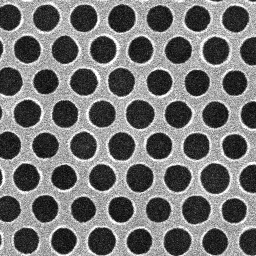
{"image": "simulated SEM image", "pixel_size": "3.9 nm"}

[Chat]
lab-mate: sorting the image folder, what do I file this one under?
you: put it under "a regular array of holes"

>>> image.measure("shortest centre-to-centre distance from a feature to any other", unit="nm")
143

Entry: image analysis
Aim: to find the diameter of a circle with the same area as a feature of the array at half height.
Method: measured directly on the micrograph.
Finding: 106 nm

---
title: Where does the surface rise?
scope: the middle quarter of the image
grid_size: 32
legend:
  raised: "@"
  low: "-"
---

@@@@@@@@@@@@@@@@@@@@@@@@@@@@@@@@
@@@----@@@@@----@@@@@@---@@@@@@@
@@------@@@------@@@@------@@@@-
@@------@@@-------@@@------@@@--
@@------@@@-------@@-------@@@--
@@------@@@-------@@@------@@@--
@@------@@@------@@@@------@@@--
@@@----@@@@@----@@@@@@---@@@@@@-
@@@@@@@@@@@@@@@@@@@@@@@@@@@@@@@@
--@@@@@@---@@@@@@----@@@@@@---@@
---@@@@-----@@@@------@@@@-----@
----@@-------@@@------@@@-------
----@@-------@@--------@@-------
----@@-------@@--------@@-------
---@@@@-----@@@@------@@@@-----@
--@@@@@@---@@@@@@----@@@@@@---@@
@@@@@@@@@@@@@@@@@@@@@@@@@@@@@@@@
@@@----@@@@@@---@@@@@@---@@@@@@@
@@------@@@@-----@@@@-----@@@@--
@@------@@@-------@@@------@@@--
@-------@@@-------@@@------@@@--
@@------@@@-------@@-------@@@--
@@------@@@@-----@@@@-----@@@@--
@@@----@@@@@-----@@@@@----@@@@@-
@@@@@@@@@@@@@@@@@@@@@@@@@@@@@@@@
--@@@@@@---@@@@@@----@@@@@----@@
---@@@@-----@@@@------@@@@-----@
---@@@-------@@@------@@@-------
---@@@-------@@--------@@-------
---@@@-------@@@------@@@-------
---@@@@-----@@@@------@@@@-----@
@@@@@@@@---@@@@@@----@@@@@----@@